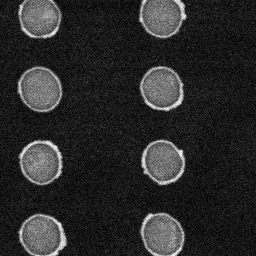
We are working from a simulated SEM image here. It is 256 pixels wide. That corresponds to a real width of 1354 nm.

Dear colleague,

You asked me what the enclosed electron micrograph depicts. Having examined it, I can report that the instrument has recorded holes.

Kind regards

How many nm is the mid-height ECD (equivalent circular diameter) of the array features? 207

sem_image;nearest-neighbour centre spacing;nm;390